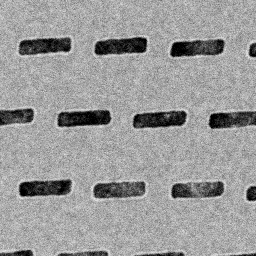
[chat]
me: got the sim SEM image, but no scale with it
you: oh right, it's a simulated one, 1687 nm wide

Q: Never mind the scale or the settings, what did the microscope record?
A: a regular array of holes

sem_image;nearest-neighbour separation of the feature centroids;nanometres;500